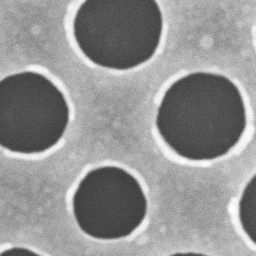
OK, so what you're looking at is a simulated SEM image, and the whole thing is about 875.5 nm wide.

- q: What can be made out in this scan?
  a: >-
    holes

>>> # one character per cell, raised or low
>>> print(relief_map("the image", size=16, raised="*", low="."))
*****.....******
*****.....******
*****.....******
*****....*******
*.**********..**
....*******....*
....******.....*
....******.....*
....******.....*
*..********...**
******.*********
*****....******.
*****....******.
*****....******.
*****...*******.
****************